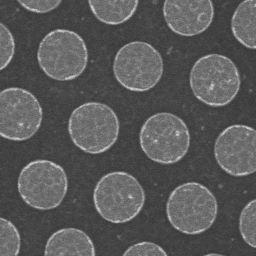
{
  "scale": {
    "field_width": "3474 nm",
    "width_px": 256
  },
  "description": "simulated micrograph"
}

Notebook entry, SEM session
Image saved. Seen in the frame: a regular array of raised bodies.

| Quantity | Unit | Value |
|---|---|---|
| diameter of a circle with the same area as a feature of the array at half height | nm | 681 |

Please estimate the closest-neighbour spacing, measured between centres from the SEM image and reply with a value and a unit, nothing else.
1.01 µm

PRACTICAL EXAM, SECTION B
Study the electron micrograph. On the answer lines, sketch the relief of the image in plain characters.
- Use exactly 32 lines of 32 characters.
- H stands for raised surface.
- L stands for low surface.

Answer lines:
LLLHHHHLLLLHHHHHHLLLLHHHHHLLLLHH
LLLLLHLLLLLLHHHHHLLLHHHHHHHLLHHH
LLLLLLLLLLLLLHHHLLLLLHHHHHLLLHHH
HLLLLLLLLLLLLLLLLLLLLHHHHHLLLHHH
HLLLLLHHHHLLLLLLLLLLLLLLLLLLLHHH
HHLLLHHHHHHLLLLLHHLLLLLLLLLLLLHH
HHLLLHHHHHHLLLLHHHHHLLLLLLLLLLLL
HLLLLHHHHHHLLLHHHHHHLLLLLHHHHLLL
LLLLLHHHHHHLLLHHHHHHLLLLHHHHHLLL
LLLLLLHHHHLLLLHHHHHHLLLLHHHHHHLL
LLLLLLLLLLLLLLLHHHHLLLLLHHHHHHLL
HHHLLLLLLLLLLLLLLLLLLLLLHHHHHHLL
HHHHLLLLLLLLLLLLLLLLLLLLLHHHHLLL
HHHHHLLLLLHHHHLLLLLLLLLLLLLLLLLL
HHHHHLLLLHHHHHLLLLLHHHLLLLLLLLLL
HHHHHLLLLHHHHHHLLLHHHHHLLLLLLLLL
HHHHLLLLLHHHHHHLLLHHHHHHLLLLHHHH
LLHLLLLLLHHHHHLLLLHHHHHHLLLHHHHH
LLLLLLLLLLHHHHLLLLHHHHHLLLLHHHHH
LLLLLLLLLLLLLLLLLLLHHHHLLLLHHHHH
LLLLHHHLLLLLLLLLLLLLLLLLLLLHHHHH
LLLHHHHHLLLLLLLLLLLLLLLLLLLLHHHH
LLHHHHHHLLLLLHHHHLLLLLLLLLLLLLLL
LLHHHHHHLLLLHHHHHHLLLLHHHHLLLLLL
LLLHHHHHLLLLHHHHHHLLLHHHHHHLLLLL
LLLLHHHLLLLLHHHHHHLLLHHHHHHLLLLH
LLLLLLLLLLLLHHHHHLLLLHHHHHHLLLHH
HLLLLLLLLLLLLHHHLLLLLHHHHHHLLLHH
HHLLLLLLLLLLLLLLLLLLLLHHHHLLLLHH
HHLLLLHHHHHLLLLLLLLLLLLLLLLLLLHH
HHLLLLHHHHHHLLLLLHHLLLLLLLLLLLLH
HHLLLLHHHHHHLLLLHHHHHLLLLLLLLLLL